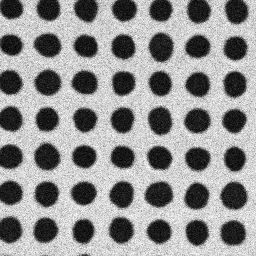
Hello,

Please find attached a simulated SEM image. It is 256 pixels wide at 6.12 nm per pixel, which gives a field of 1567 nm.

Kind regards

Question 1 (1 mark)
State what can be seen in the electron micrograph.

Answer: a regular array of holes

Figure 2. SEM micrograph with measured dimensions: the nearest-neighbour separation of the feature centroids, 224 nanometres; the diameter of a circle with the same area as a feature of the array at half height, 0.149 micrometres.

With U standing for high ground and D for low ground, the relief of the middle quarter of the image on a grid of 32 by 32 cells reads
UUUUUUUUUUUUUUUUUUUUUUUUUUUUUUUU
UUUUUUUUUUUUUUUUUUUUUUUUUUUUUUUU
UUUDDDDUUUUUUDDDDUUUUUDDDDUUUUUU
UUUDDDDDUUUUDDDDDUUUUDDDDDDUUUUD
UUDDDDDDUUUUDDDDDDUUUDDDDDDUUUUD
UUDDDDDDUUUUDDDDDDUUUDDDDDDUUUDD
UUUDDDDDUUUUDDDDDUUUUUDDDDDUUUUD
UUUUDDDUUUUUUDDDUUUUUUUDDDUUUUUU
UUUUUUUUUUUUUUUUUUUUUUUUUUUUUUUU
UUUUUUUUUUUUUUUUUUUUUUUUUUUUUUUU
UUUUUUUUUUUUUUUUUUUUUUUUUUUUUUUU
UUUDDDDUUUUUUDDDUUUUUUDDDDUUUUUU
UUDDDDDDUUUUDDDDDUUUUDDDDDDUUUUD
UUDDDDDDUUUUDDDDDDUUUDDDDDDUUUDD
UUDDDDDDUUUUDDDDDUUUUDDDDDDUUUDD
UUUDDDDDUUUUDDDDDUUUUDDDDDDUUUDD
UUUUDDDUUUUUUDDDUUUUUUDDDDDUUUUD
UUUUUUUUUUUUUUUUUUUUUUUDDUUUUUUU
UUUUUUUUUUUUUUUUUUUUUUUUUUUUUUUU
UUUUUUUUUUUUUUUUUUUUUUUUUUUUUUUU
UUUUDDUUUUUUUDDUUUUUUUUDUUUUUUUU
UUUDDDDDUUUUDDDDDUUUUDDDDDUUUUUD
UUDDDDDDUUUUDDDDDDUUUDDDDDDUUUDD
UUDDDDDDUUUUDDDDDDUUUDDDDDDUUUDD
UUDDDDDDUUUUDDDDDUUUUDDDDDDUUUDD
UUUDDDDUUUUUUDDDDUUUUUDDDDUUUUUD
UUUUUUUUUUUUUUUUUUUUUUUUDUUUUUUU
UUUUUUUUUUUUUUUUUUUUUUUUUUUUUUUU
UUUUUUUUUUUUUUUUUUUUUUUUUUUUUUUU
UUUUUDUUUUUUUUDDUUUUUUUDDUUUUUUU
UUDDDDDUUUUUDDDDDUUUUDDDDDUUUUUU
UUDDDDDDUUUUDDDDDUUUDDDDDDDUUUUD